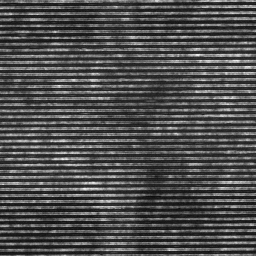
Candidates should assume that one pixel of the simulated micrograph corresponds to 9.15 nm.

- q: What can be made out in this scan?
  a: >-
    parallel lines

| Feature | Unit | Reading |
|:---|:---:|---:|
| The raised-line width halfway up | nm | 16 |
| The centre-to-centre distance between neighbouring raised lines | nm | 55.5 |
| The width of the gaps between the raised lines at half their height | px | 4.13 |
